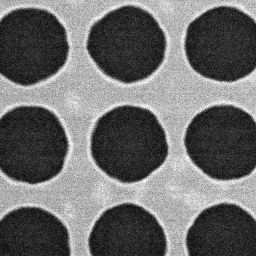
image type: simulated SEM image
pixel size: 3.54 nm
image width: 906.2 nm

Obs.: holes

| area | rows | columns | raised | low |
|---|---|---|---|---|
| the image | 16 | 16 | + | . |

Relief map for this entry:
+.+++++..++++..+
....++....++....
....+.....++....
....++....++....
....++....++....
++++++++++++++++
++++++++++++++++
....++....++....
....++....++....
....++.....+....
....++....++....
++++++++++++++++
++++++++++++++++
...+++....++....
....++....++....
....++....++....